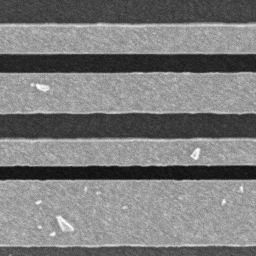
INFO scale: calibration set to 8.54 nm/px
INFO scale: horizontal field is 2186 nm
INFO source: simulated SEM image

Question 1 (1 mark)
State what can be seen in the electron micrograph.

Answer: lines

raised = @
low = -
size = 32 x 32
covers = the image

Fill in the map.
--------------------------------
--------------------------------
--------------------------------
@@@@@@@@@@@@@@@@@@@@@@@@@@@@@@@@
@@@@@@@@@@@@@@@@@@@@@@@@@@@@@@@@
@@@@@@@@@@@@@@@@@@@@@@@@@@@@@@@@
@@@@@@@@@@@@@@@@@@@@@@@@@@@@@@@@
--------------------------------
--------------------------------
@@@@@@@@@@@@@@@@@@@@@@@@@@@@@@@@
@@@@@@@@@@@@@@@@@@@@@@@@@@@@@@@@
@@@@@@@@@@@@@@@@@@@@@@@@@@@@@@@@
@@@@@@@@@@@@@@@@@@@@@@@@@@@@@@@@
@@@@@@@@@@@@@@@@@@@@@@@@@@@@@@@@
--------------------------------
--------------------------------
--------------------------------
@@@@@@@@@@@@@@@@@@@@@@@@@@@@@@@@
@@@@@@@@@@@@@@@@@@@@@@@@@@@@@@@@
@@@@@@@@@@@@@@@@@@@@@@@@@@@@@@@@
@@@@@@@@@@@@@@@@@@@@@@@@@@@@@@@@
--------------------------------
--------------------------------
@@@@@@@@@@@@@@@@@@@@@@@@@@@@@@@@
@@@@@@@@@@@@@@@@@@@@@@@@@@@@@@@@
@@@@@@@@@@@@@@@@@@@@@@@@@@@@@@@@
@@@@@@@@@@@@@@@@@@@@@@@@@@@@@@@@
@@@@@@@@@@@@@@@@@@@@@@@@@@@@@@@@
@@@@@@@@@@@@@@@@@@@@@@@@@@@@@@@@
@@@@@@@@@@@@@@@@@@@@@@@@@@@@@@@@
@@@@@@@@@@@@@@@@@@@@@@@@@@@@@@@@
--------------------------------